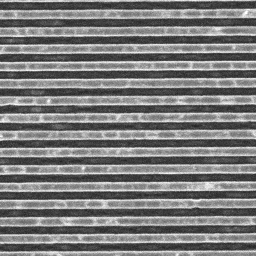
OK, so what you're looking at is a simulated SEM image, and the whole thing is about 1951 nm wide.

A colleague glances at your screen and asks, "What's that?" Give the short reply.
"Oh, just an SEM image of parallel lines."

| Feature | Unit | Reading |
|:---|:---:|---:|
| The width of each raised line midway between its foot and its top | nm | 62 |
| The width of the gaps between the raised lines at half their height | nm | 68.6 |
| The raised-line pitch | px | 17.3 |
